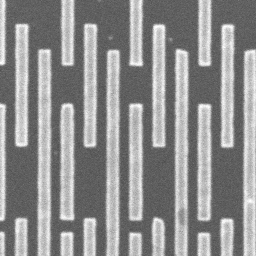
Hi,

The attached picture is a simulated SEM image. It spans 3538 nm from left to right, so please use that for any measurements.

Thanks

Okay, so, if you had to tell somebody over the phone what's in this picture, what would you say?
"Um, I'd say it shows wiring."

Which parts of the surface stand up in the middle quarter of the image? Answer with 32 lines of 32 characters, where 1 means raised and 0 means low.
00000111000110000000001110001110
00000111000110000000001110001110
00000111000110000000001110001110
00000111000110000000001110001110
00000111000110000000001110001110
00000111000110000000001110001110
00000111000110000000001110001110
00000111000110000000001110001110
00000111000110000000001110001110
00000111000110000000001110001110
11000111000110000110001110001110
11000111000110000110001110001110
11000111000110000110001110001110
11000111000110000110001110001110
11000111000110000110001110001110
11000111000110000110001110001110
11000111000110000110001110001110
11000111000110000110001110001110
11000111000110000110001110001110
11000111000110000110001110001110
11000111000110000110001110001110
11000000000110000110000000001110
11000000000110000110000000001110
11000000000110000110000000001110
11000000000110000110000000001110
11000000000110000110000000001110
11000000000110000110000000001110
11000000000110000110000000001110
11000000000110000110000000001110
11000000000110000110000000001110
11000000000110000110000000001110
11000000000110000110000000001110